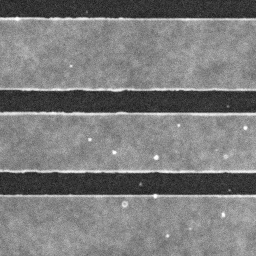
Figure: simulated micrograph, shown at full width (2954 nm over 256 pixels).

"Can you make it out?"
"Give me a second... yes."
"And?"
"lines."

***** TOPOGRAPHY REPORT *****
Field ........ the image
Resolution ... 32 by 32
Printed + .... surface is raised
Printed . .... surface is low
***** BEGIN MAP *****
................................
................................
++++++++++++++++++++++++++++++++
++++++++++++++++++++++++++++++++
++++++++++++++++++++++++++++++++
++++++++++++++++++++++++++++++++
++++++++++++++++++++++++++++++++
++++++++++++++++++++++++++++++++
++++++++++++++++++++++++++++++++
++++++++++++++++++++++++++++++++
++++++++++++++++++++++++++++++++
................................
................................
................................
++++++++++++++++++++++++++++++++
++++++++++++++++++++++++++++++++
++++++++++++++++++++++++++++++++
++++++++++++++++++++++++++++++++
++++++++++++++++++++++++++++++++
++++++++++++++++++++++++++++++++
++++++++++++++++++++++++++++++++
.++.....++.++...+++.++++++++.+++
................................
................................
++++++++++++++++++++++++++++++++
++++++++++++++++++++++++++++++++
++++++++++++++++++++++++++++++++
++++++++++++++++++++++++++++++++
++++++++++++++++++++++++++++++++
++++++++++++++++++++++++++++++++
++++++++++++++++++++++++++++++++
++++++++++++++++++++++++++++++++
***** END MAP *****